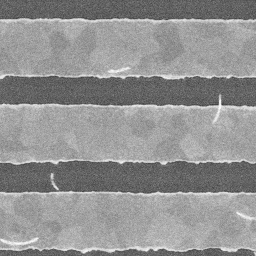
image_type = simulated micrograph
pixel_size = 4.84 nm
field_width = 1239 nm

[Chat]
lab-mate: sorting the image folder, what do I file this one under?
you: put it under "lines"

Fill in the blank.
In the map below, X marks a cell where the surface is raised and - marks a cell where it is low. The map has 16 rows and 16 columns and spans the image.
----------------
XXXXXXXXXXXXXXXX
XXXXXXXXXXXXXXXX
XXXXXXXXXXXXXXXX
XXXXXXXXXXXXXXXX
----------------
----------------
XXXXXXXXXXXXXXXX
XXXXXXXXXXXXXXXX
XXXXXXXXXXXXXXXX
----------------
----------------
XXXXXXXXXXXXXXXX
XXXXXXXXXXXXXXXX
XXXXXXXXXXXXXXXX
XXXXXXXXXXXXXXXX